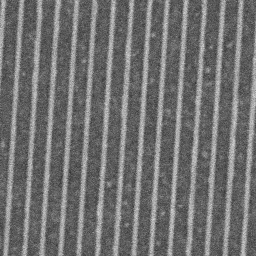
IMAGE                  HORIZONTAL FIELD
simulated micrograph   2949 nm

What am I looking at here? parallel lines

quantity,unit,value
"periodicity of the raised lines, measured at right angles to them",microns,0.211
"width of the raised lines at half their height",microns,0.0373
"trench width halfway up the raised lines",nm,171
